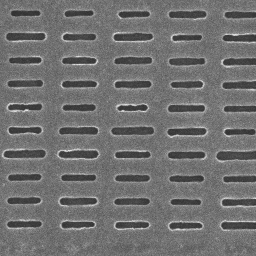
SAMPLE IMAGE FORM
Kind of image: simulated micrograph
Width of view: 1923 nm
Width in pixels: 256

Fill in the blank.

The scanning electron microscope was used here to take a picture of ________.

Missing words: a regular array of holes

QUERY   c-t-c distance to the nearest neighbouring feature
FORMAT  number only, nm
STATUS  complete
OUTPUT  175